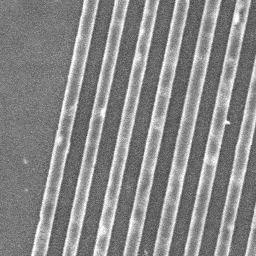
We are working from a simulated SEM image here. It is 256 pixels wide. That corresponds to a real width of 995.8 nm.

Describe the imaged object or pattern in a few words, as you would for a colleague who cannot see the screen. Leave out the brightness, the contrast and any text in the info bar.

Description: parallel lines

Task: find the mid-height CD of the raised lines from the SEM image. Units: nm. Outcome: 51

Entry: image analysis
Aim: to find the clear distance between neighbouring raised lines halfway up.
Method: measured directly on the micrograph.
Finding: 64.8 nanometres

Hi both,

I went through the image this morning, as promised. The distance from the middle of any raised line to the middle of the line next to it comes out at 116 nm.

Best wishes